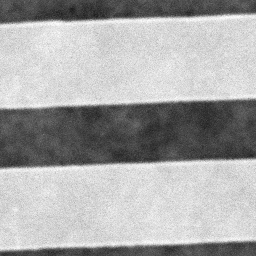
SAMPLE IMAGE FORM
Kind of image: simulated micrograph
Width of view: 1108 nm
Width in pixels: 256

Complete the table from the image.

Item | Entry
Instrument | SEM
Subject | one or a few lines or trenches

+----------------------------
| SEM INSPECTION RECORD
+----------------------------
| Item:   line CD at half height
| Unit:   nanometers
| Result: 349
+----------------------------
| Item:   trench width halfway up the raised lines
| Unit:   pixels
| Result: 61.7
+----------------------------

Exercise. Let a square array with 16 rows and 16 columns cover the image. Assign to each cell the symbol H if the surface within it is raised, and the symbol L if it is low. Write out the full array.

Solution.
LLLLLLLLLLLLLLLL
LHHHHHHHHHHHHHHH
HHHHHHHHHHHHHHHH
HHHHHHHHHHHHHHHH
HHHHHHHHHHHHHHHH
HHHHHHHHHHHHHHHH
HHHHHHLLLLLLLLLL
LLLLLLLLLLLLLLLL
LLLLLLLLLLLLLLLL
LLLLLLLLLLLLLLLL
LLLLHHHHHHHHHHHH
HHHHHHHHHHHHHHHH
HHHHHHHHHHHHHHHH
HHHHHHHHHHHHHHHH
HHHHHHHHHHHHHHHH
HHLLLLLLLLLLLLLL